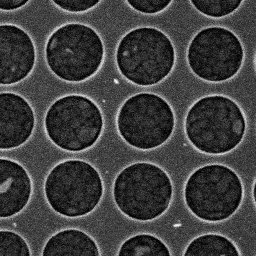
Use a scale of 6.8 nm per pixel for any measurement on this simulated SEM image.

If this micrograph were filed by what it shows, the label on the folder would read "a regular array of holes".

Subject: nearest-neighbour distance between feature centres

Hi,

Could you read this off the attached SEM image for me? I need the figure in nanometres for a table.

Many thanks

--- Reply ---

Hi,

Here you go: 463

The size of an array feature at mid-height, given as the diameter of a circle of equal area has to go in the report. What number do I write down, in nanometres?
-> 388